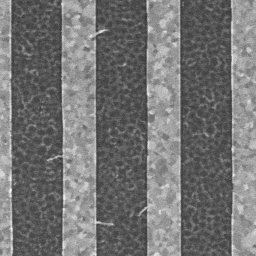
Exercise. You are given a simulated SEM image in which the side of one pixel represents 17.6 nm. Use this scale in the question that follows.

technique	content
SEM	one or a few lines or trenches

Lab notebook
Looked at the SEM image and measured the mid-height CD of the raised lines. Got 575 nanometers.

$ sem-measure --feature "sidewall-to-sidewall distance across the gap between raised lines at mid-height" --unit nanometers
912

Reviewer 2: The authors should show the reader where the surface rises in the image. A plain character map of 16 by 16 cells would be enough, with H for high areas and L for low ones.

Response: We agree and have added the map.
HLLLHHLLLHHLLLLH
HLLLHHLLLHHLLLLH
HLLLHHLLLHHLLLLH
HLLLHHLLLHHLLLLH
HLLLHHLLLHHLLLLH
HLLLHHLLLHHLLLLH
HLLLHHLLLHHLLLLH
HLLLHHLLLHHLLLLH
HLLLHHLLLHHLLLLH
HLLLHHLLLHHLLLLH
HLLLHHLLLHHLLLLH
HLLLHHLLLHHLLLLH
HLLLHHLLLHHLLLLH
HLLLHHLLLHHLLLLH
HLLLHHLLLHHLLLLH
HLLLHHLLLHHLLLLH